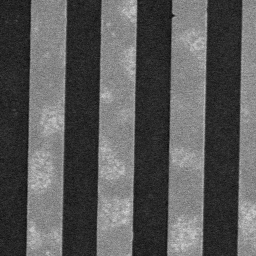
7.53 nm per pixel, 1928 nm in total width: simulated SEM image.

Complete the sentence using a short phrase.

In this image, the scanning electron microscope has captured one or a few lines or trenches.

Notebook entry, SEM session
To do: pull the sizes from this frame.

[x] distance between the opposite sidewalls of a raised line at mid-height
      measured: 267 nm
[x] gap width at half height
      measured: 0.266 micrometres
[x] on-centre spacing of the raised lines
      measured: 70.4 pixels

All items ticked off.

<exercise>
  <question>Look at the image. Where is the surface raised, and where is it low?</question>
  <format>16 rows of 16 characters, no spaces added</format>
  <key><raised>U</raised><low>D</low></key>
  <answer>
DDUUDDUUUDDUUDDU
DDUUDDUUUDDUUDDU
DDUUDDUUUDDUUDDU
DDUUDDUUDDDUUDDU
DDUUDDUUDDDUUDDU
DDUUDDUUDDDUUDDU
DDUUDDUUDDDUUDDU
DDUUDDUUDDDUUDDU
DDUUDDUUDDDUUDDU
DDUUDDUUDDDUUDDU
DDUUDDUUDDDUUDDU
DDUUDDUUDDDUUDDU
DDUUDDUUDDDUUDDU
DDUUDDUUDDUUUDDU
DDUUDDUUDDUUUDDU
DDUUDDUUDDUUUDDU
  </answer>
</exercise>